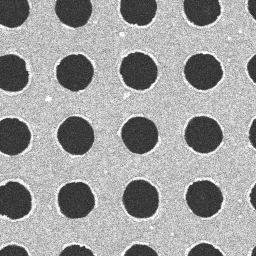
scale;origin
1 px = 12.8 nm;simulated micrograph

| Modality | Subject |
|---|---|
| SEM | a regular array of holes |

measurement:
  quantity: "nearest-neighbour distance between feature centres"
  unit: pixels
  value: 63.3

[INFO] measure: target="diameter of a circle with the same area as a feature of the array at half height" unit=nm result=478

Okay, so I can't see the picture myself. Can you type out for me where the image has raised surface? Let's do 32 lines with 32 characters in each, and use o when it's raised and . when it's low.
....ooo....oooo.....ooo....oooo.
....ooo.....ooo.....ooo.....ooo.
...ooooo...ooooo...ooooo...ooooo
oooooooooooooooooooooooooooooooo
oooooooooooooooooooooooooooooooo
oooooooooooooooooooooooooooooooo
oooooooooooooooooooooooooooooooo
...ooooo...oooo....ooooo...oooo.
...oooo.....ooo.....ooo.....ooo.
....ooo.....ooo.....ooo.....ooo.
...ooooo...ooooo...ooooo...ooooo
oooooooooooooooooooooooooooooooo
oooooooooooooooooooooooooooooooo
oooooooooooooooooooooooooooooooo
ooooooooooooooooooooooooo.oooooo
...ooooo...ooooo...oooo....oooo.
....ooo.....ooo.....ooo.....ooo.
....ooo.....ooo.....ooo.....ooo.
...ooooo...ooooo...ooooo...ooooo
oooooooooooooooooooooooooooooooo
oooooooooooooooooooooooooooooooo
oooooooooooooooooooooooooooooooo
ooooooooooooooooo.oooooooooooooo
...ooooo...ooooo...ooooo...ooooo
....ooo.....ooo.....ooo.....ooo.
....ooo.....ooo.....ooo.....ooo.
....oooo...ooooo...ooooo...ooooo
oooooooooooooooooooooooooooooooo
oooooooooooooooooooooooooooooooo
oooooooooooooooooooooooooooooooo
ooooooooooooooooooooooooo.oooooo
...ooooo....oooo...ooooo....oooo